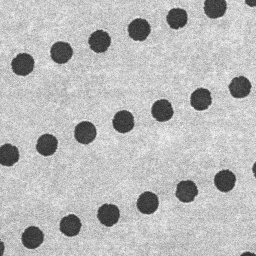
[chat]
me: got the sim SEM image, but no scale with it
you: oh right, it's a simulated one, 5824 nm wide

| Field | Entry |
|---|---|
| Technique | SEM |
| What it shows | a regular array of holes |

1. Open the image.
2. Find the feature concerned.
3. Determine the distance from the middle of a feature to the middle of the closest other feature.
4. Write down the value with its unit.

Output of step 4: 907 nm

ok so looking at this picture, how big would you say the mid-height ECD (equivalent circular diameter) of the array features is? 528 nanometers